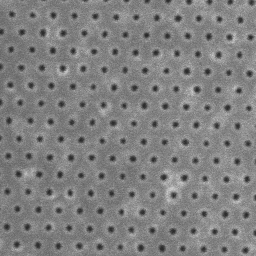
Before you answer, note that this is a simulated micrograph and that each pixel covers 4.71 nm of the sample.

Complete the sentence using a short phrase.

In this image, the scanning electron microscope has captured a regular array of holes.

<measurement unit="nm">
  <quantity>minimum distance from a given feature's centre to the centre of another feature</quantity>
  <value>94.8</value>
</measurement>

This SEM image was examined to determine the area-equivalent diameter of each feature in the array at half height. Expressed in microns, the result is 0.0314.